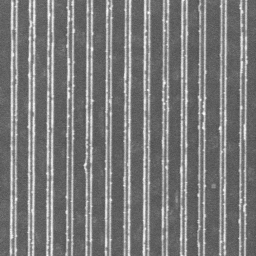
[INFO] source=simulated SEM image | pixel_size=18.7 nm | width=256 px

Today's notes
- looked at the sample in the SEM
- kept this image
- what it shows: parallel lines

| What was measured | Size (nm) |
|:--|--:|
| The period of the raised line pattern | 357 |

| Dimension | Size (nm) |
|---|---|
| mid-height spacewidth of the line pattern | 257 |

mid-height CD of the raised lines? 91.1 nanometers